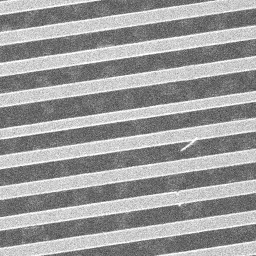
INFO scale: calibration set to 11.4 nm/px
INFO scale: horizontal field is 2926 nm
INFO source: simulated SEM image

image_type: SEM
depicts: parallel lines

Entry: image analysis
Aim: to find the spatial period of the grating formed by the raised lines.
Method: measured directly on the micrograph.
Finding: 0.348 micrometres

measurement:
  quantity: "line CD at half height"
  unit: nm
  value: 137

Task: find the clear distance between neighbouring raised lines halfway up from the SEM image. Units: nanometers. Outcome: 206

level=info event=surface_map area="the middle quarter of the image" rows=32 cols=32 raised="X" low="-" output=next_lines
-------------------------------X
-------------------------XXXXXXX
--X----------------XXXXXXXXXXXXX
------------XXXXXXXXXXXXXXXXXXXX
-----XXXXXXXXXXXXXXXXXXXXX------
XXXXXXXXXXXXXXXXXXX-------------
XXXXXXXXXXXX--------------------
XXXXXX--------------------------
--------------------------------
------------------------------XX
------------------------XXXXXXXX
-----------------XXXXXXXXXXXXXXX
----------XXXXXXXXXXXXXXXX------
---XXXXXXXXXXXXXXXX-------------
XXXXXXXXXXXX--------------------
XXXXX---------------------------
----------------------------XXXX
----------------------XXXXXXXXXX
---------------XXXXXXXXXXXXXXXXX
--------XXXXXXXXXXXXXXXXXXXX----
--XXXXXXXXXXXXXXXXXXXX----------
XXXXXXXXXXXXXXX-----------------
XXXXXXXX------------------------
X-------------------------------
--------------------------XXXXXX
--------------------XXXXXXXXXXXX
-------------XXXXXXXXXXXXXXXXXXX
------XXXXXXXXXXXXXXXXXXXXX-----
XXXXXXXXXXXXXXXXXXXX------------
XXXXXXXXXXXXX--------------XX---
XXXXXXX--------------------X----
------------------------------XX